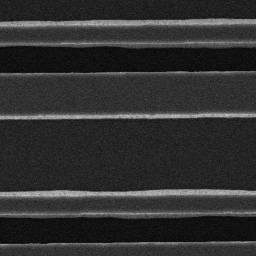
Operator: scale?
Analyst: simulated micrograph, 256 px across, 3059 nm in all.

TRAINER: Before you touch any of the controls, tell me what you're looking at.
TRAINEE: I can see lines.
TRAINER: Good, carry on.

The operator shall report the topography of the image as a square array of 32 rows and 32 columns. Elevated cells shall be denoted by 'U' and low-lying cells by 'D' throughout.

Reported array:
DDDDDDDDDDDDDDDDDDDDDDDDDDDDDDDD
DDDDDDDDDDDDDDDDDDDDDDDDDDDDDDDD
DDDDDDDDDDDDDDDDDDDDDDDDDDDDDDDD
UUUUUUUUUUUUUUUUUUUUUUUUUUUUUUUU
UUUUUUUUUUUUUUUUUUUUUUUUUUUUUUUU
UUUDDDUUDUUDDDDDDDDDDDDDDDDDDDDD
DDDDDDDDDDDDDDDDDDDDDDDDDDDDDDDD
DDDDDDDDDDDDDDDDDDDDDDDDDDDDDDDD
DDDDDDDDDDDDDDDDDDDDDDDDDDDDDDDD
UUUUUUUUUUUUUUUUUUUUUUUUUUUUUUUU
UUUUUUUUUUUUUUUUUUUUUUUUUUUUUUUU
UUUUUUUUUUUUUUUUUUUUUUUUUUUUUUUU
UUUUUUUUUUUUUUUUUUUUUUUUUUUUUUUU
UUUUUUUUUUUUUUUUUUUUUUUUUUUUUUUU
UUUUUUUUUUUUUDDDDDDDDDDDDDDDDDDD
DDDDDDDDDDDDDDDDDDDDDDDDDDDDDDDD
DDDDDDDDDDDDDDDDDDDDDDDDDDDDDDDD
DDDDDDDDDDDDDDDDDDDDDDDDDDDDDDDD
DDDDDDDDDDDDDDDDDDDDDDDDDDDDDDDD
DDDDDDDDDDDDDDDDDDDDDDDDDDDDDDDD
DDDDDDDDDDDDDDDDDDDDDDDDDDDDDDDD
DDDDDDDDDDDDDDDDDDDDDDDDDDDDDDDD
DDDDDDDDDDDDDDDDDDDDDDDDDDDDDDDD
DDDDDDDDDDDDDDDDDDDDDDDDDDDDDDDD
UUUUUUUUUUUUUUUUUUUUUUUUUUUUUUUU
UUUUUUUUUUUUUUUUUUUUUUUUUUUUUUUU
UUUUUUUUUUUUUUUUUUUUUUUUUUUUUUUU
DDDDDDDDDDDDDDDDDDDDDDDDDDDDDDDD
DDDDDDDDDDDDDDDDDDDDDDDDDDDDDDDD
DDDDDDDDDDDDDDDDDDDDDDDDDDDDDDDD
DDDDDDUUUUUUUUUUUUUUUUUUUUUUUUUU
UUUUUUUUUUUUUUUUUUUUUUUUUUUUUUUU